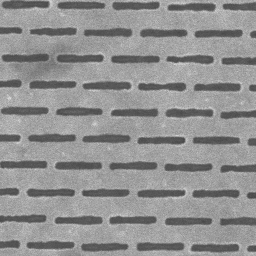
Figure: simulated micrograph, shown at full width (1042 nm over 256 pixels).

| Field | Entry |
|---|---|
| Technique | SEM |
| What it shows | a regular array of holes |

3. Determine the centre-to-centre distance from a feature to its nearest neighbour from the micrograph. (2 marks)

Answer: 0.152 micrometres